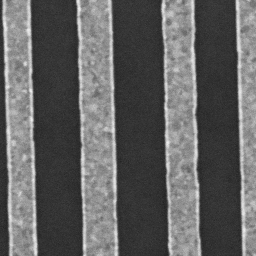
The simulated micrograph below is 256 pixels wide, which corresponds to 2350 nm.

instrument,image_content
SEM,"one or a few lines or trenches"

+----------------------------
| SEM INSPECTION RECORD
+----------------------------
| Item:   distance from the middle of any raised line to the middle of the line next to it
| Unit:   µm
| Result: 0.739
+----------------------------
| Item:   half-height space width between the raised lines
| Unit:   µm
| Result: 0.448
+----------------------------